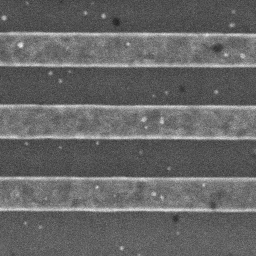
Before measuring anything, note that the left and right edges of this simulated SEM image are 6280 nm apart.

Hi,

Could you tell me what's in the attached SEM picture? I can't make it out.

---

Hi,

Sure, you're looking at wiring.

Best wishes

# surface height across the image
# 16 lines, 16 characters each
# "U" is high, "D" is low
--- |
DDDDDDDDDDDDDDDD
DDDDDDDDDDDDDDDD
UUUUUUUUUUUUUUUU
UUUUUUUUUUUUUUUU
DDDDDDDDDDDDDDDD
DDDDDDDDDDDDDDDD
DDDDDDDDDDDDDDDD
UUUUUUUUUUUUUUUU
UUUUUUUUUUUUUUUU
DDDDDDDDDDDDDDDD
DDDDDDDDDDDDDDDD
UUUUUUUUUUUUUUUU
UUUUUUUUUUUUUUUU
DDDDDDDDDDDDDDDD
DDDDDDDDDDDDDDDD
DDDDDDDDDDDDDDDD